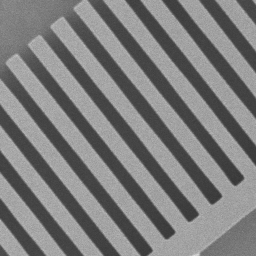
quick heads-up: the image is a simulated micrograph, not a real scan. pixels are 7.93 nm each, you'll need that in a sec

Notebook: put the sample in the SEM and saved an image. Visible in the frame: groups of lines, slits or small figures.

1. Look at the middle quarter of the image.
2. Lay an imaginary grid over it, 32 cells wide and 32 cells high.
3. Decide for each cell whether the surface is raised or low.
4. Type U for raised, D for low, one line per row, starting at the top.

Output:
DDDDDUUUUDDDDDUUUUUDDDDUUUUUDDDD
UDDDDUUUUUDDDDDUUUUDDDDDUUUUUDDD
UUDDDDUUUUUDDDDUUUUUDDDDDUUUUUDD
UUUDDDDUUUUUDDDDUUUUUDDDDUUUUUDD
UUUDDDDUUUUUUDDDDUUUUUDDDDUUUUUD
UUUUDDDDUUUUUDDDDDUUUUDDDDDUUUUU
UUUUUDDDDUUUUUDDDDDUUUUDDDDDUUUU
DUUUUUDDDDUUUUUDDDDDUUUUDDDDDUUU
DUUUUUUDDDDUUUUUDDDDUUUUUDDDDUUU
DDUUUUUDDDDDUUUUDDDDDUUUUUDDDDUU
DDDUUUUUDDDDUUUUUDDDDDUUUUUDDDDU
DDDDUUUUUDDDDUUUUUDDDDDUUUUDDDDD
DDDDDUUUUUDDDDUUUUUDDDDUUUUUDDDD
UDDDDUUUUUUDDDDUUUUUDDDDUUUUUDDD
UUDDDDUUUUUDDDDDUUUUDDDDDUUUUUDD
UUUDDDDUUUUUDDDDUUUUUDDDDDUUUUUD
UUUUDDDDUUUUUDDDDUUUUUDDDDUUUUUD
UUUUDDDDDUUUUUDDDDUUUUUDDDDUUUUU
UUUUUDDDDUUUUUDDDDDUUUUUDDDDUUUU
DUUUUUDDDDUUUUUDDDDDUUUUDDDDDUUU
DDUUUUUDDDDUUUUUDDDDUUUUUDDDDDUU
DDUUUUUDDDDDUUUUUDDDDUUUUUDDDDUU
DDDUUUUUDDDDDUUUUUDDDDUUUUUDDDDU
DDDDUUUUUDDDDUUUUUDDDDDUUUUUDDDD
DDDDDUUUUUDDDDUUUUUDDDDUUUUUUDDD
UDDDDDUUUUUDDDDUUUUUDDDDUUUUUDDD
UUDDDDDUUUUDDDDDUUUUUDDDDUUUUUDD
UUUDDDDUUUUUDDDDDUUUUUDDDDUUUUUD
UUUDDDDDUUUUUDDDDUUUUUDDDDDUUUUU
UUUUDDDDDUUUUUDDDDUUUUUDDDDUUUUU
UUUUUDDDDDUUUUDDDDDUUUUUDDDDUUUU
DUUUUUDDDDDUUUUDDDDDUUUUUDDDDUUU